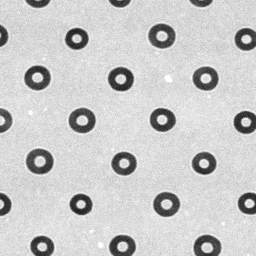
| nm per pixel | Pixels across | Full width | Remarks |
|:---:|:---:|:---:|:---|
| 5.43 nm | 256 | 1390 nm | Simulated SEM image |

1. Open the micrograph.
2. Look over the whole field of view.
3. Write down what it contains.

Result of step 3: a regular array of ring-shaped grooves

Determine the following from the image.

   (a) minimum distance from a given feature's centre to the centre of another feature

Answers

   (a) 312 nanometres